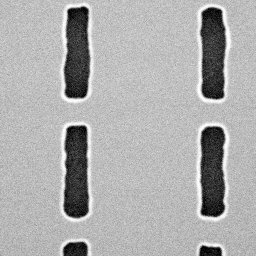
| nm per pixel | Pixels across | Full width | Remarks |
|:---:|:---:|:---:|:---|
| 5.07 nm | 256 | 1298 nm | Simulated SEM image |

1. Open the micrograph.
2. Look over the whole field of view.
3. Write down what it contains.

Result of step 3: holes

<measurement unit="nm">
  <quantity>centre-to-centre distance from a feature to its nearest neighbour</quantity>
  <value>599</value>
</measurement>